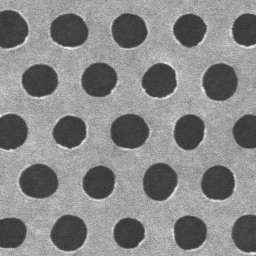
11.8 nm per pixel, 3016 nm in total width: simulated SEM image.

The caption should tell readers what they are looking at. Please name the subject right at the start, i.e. a regular array of holes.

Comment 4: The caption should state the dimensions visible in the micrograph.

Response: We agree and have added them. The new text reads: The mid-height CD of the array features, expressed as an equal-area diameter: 414 nanometers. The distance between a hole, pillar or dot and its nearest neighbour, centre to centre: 688 nanometers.